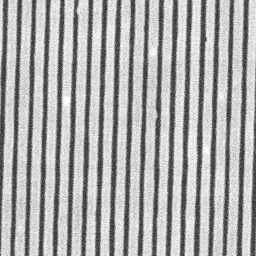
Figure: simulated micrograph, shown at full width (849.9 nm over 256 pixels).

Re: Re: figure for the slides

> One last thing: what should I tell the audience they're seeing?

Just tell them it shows parallel lines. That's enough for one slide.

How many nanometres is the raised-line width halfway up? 30.7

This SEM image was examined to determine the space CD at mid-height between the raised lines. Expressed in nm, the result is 17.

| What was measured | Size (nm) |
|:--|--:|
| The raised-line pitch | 46.9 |